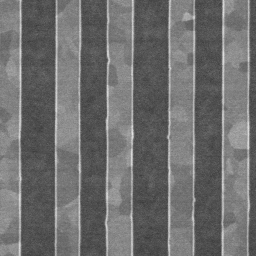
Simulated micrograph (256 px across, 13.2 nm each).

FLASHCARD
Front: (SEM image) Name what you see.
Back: parallel lines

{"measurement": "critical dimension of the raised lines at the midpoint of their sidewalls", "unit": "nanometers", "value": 320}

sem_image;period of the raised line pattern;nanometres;742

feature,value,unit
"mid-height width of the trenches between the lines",432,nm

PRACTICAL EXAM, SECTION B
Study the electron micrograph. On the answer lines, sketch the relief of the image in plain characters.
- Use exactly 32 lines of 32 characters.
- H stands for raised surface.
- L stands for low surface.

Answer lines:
HHHLLLLHHHLLLLHHHLLLLHHHLLLLHHHL
HHHLLLLHHHLLLLHHHLLLLHHHLLLLHHHL
HHHLLLLHHHLLLLHHHLLLLHHHLLLLHHHL
HHHLLLLHHHLLLHHHHLLLLHHHLLLLHHHL
HHHLLLLHHHLLLHHHHLLLLHHHLLLLHHHL
HHHLLLLHHHLLLLHHHLLLLHHHLLLLHHHL
HHHLLLLHHHLLLLHHHLLLLHHHLLLLHHHL
HHHLLLLHHHLLLLHHLLLLLHHHLLLLHHHL
HHHLLLLHHHLLLLHHLLLLLHHHLLLLHHHL
HHLLLLLHHHLLLLHHLLLLLHHHLLLLHHHL
HHLLLLLHHHLLLLHHLLLLLHHHLLLLHHHL
HHLLLLLHHHLLLLHHLLLLLHHHLLLLHHHL
HHLLLLLHHHLLLLHHLLLLLHHHLLLLHHHL
HHLLLLLHHHLLLLHHLLLLLHHHLLLLHHHL
HHLLLLLHHHLLLLHHLLLLLHHHLLLLHHHL
HHLLLLLHHHLLLHHHLLLLLHHHLLLLHHHL
HHLLLLLHHHLLLHHHHLLLLHHHLLLLHHHL
HHLLLLLHHHLLLLHHHLLLLHHHLLLLHHHL
HHLLLLLHHHLLLLHHLLLLLHHHLLLLHHHL
HHLLLLLHHHLLLLHHLLLLLHHHLLLLHHHL
HHLLLLLHHHLLLLHHLLLLLHHHLLLLHHHL
HHLLLLLHHHLLLLHHLLLLLHHHLLLLHHHL
HHHLLLLHHHLLLHHHLLLLLHHHLLLLHHHL
HHLLLLLHHHLLLHHHLLLLLHHHLLLLHHHL
HHLLLLLHHHLLLHHHLLLLLHHHLLLLHHHL
HHLLLLLHHHLLLHHHLLLLLHHHLLLLHHHL
HHLLLLLHHHLLLHHHLLLLLHHHLLLLHHHL
HHLLLLLHHHLLLHHHLLLLLHHHLLLLHHHL
HHLLLLLHHHLLLHHHLLLLLHHHLLLLHHHL
HHLLLLLHHHLLLHHHLLLLLHHHLLLLHHHL
HHLLLLLHHHLLLHHHLLLLLHHHLLLLHHHL
HHLLLLLHHHLLLHHHLLLLLHHHLLLLHHHL